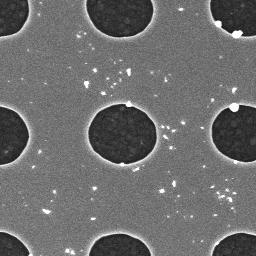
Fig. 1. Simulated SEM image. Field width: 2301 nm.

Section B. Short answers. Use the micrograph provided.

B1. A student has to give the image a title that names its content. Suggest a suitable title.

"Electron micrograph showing holes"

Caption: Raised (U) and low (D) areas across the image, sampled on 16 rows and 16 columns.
DDUUUDDDDDUUUDDD
DDUUUUDDDUUUUUDD
UUUUUUUUUUUUUUUU
UUUUUUUUUUUUUUUU
UUUUUUUUUUUUUUUU
UUUUUUUUUUUUUUUU
UUUUUUUUUUUUUUUU
DUUUUUDDDUUUUDDD
DDUUUUDDDDUUUDDD
DUUUUUDDDUUUUUDD
UUUUUUUUUUUUUUUU
UUUUUUUUUUUUUUUU
UUUUUUUUUUUUUUUU
UUUUUUUUUUUUUUUU
UUUUUUUUUUUUUUUU
DDUUUUDDDUUUUDDD